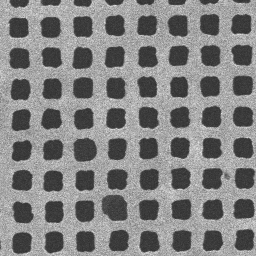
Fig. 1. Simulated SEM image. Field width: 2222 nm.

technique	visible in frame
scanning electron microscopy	a regular array of holes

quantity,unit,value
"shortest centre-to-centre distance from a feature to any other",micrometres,0.263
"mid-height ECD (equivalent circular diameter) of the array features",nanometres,184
